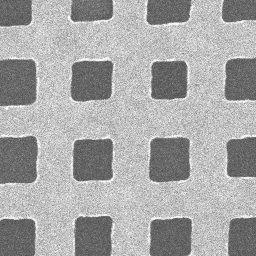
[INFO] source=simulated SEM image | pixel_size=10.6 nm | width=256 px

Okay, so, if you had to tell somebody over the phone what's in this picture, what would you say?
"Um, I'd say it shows holes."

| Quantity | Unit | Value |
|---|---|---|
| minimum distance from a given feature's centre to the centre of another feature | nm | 812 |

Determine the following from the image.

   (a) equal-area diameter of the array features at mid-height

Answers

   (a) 475 nm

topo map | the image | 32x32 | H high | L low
LLLLHHHHHLLLLLHHHHLLLLLLHHHHLLLL
LLLLHHHHHLLLLLHHHHLLLLLLHHHHLLLL
LLLLHHHHHLLLLHHHHHLLLLLHHHHHLLLL
HHHHHHHHHHHHHHHHHHHHHHHHHHHHHHHH
HHHHHHHHHHHHHHHHHHHHHHHHHHHHHHHH
HHHHHHHHHHHHHHHHHHHHHHHHHHHHHHHH
HHHHHHHHHHHHHHHHHHHHHHHHHHHHHHHH
LLLLHHHHHHHHHHHHHHHHHHHHHHHHHLLL
LLLLHHHHHLLLLLHHHHHLLLLHHHHHLLLL
LLLLHHHHHLLLLLHHHHHLLLLHHHHHLLLL
LLLLLHHHHLLLLLHHHHHLLLLHHHHHLLLL
LLLLLHHHHLLLLLHHHHHLLLLHHHHHLLLL
LLLLHHHHHLLLLHHHHHHHLHHHHHHHHLLL
HHHHHHHHHHHHHHHHHHHHHHHHHHHHHHHH
HHHHHHHHHHHHHHHHHHHHHHHHHHHHHHHH
HHHHHHHHHHHHHHHHHHHHHHHHHHHHHHHH
HHHHHHHHHHHHHHHHHHHHHHHHHHHHHHHH
LLLLLHHHHHLLLLHHHHHLLLLHHHHHHLLL
LLLLLHHHHLLLLLHHHHHLLLLLHHHHLLLL
LLLLLHHHHLLLLLHHHHHLLLLLHHHHLLLL
LLLLLHHHHLLLLLHHHHHLLLLLHHHHLLLL
LLLLLHHHHLLLLLHHHHHLLLLLHHHHLLLL
LLLLHHHHHLLLLHHHHHHLLLLHHHHHHHHH
HHHHHHHHHHHHHHHHHHHHHHHHHHHHHHHH
HHHHHHHHHHHHHHHHHHHHHHHHHHHHHHHH
HHHHHHHHHHHHHHHHHHHHHHHHHHHHHHHH
HHHHHHHHHHHHHHHHHHHHHHHHHHHHHHHH
LLLLHHHHHHLLLLHHHHHLLLLLHHHHHLLL
LLLLHHHHHLLLLLHHHHHLLLLLHHHHHLLL
LLLLHHHHHLLLLLHHHHHLLLLLHHHHHLLL
LLLLHHHHHLLLLLHHHHHLLLLLHHHHHLLL
LLLLHHHHHLLLLLHHHHHLLLLLHHHHLLLL